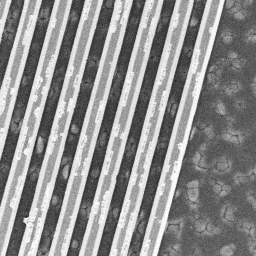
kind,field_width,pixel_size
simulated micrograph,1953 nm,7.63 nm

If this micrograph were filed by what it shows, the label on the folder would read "parallel lines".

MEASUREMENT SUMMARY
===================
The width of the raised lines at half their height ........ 101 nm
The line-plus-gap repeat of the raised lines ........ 224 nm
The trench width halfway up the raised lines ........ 0.129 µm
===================